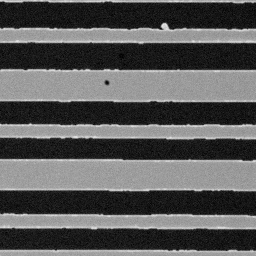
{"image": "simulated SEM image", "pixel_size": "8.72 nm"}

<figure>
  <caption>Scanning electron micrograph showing lines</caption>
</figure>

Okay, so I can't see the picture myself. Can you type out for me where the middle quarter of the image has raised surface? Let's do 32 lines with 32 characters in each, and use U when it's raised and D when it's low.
DDDDDDDDDDDDDDDDDDDDDDDDDDDDDDDD
DDUUUUUDDDUUUUDDDDDDDDDDDDDDUDDD
UUUUUUUUUUUUUUUUUUUUUUUUUUUUUUUU
UUUUUUUUUUUUUUUUUUUUUUUUUUUUUUUU
UUUUUUUUUUUUUUUUUUUUUUUUUUUUUUUU
UUUUUUUUUUUUUUUUUUUUUUUUUUUUUUUU
UUUUUUUUUUUUUUUUUUUUUUUUUUUUUUUU
UUUUUUUUUUUUUUUUUUUUUUUUUUUUUUUU
UUUUUUUUUUUUUUUUUUUUUUUUUUUUUUUU
DDDDDDDDDDDDDDDDDDDDDDDDDDDDDDDD
DDDDDDDDDDDDDDDDDDDDDDDDDDDDDDDD
DDDDDDDDDDDDDDDDDDDDDDDDDDDDDDDD
DDDDDDDDDDDDDDDDDDDDDDDDDDDDDDDD
DDDDDDDDDDDDDDDDDDDDDDDDDDDDDDDD
DDDDDDDDDDDDDDDDDDDDDDDDDDDDDDDD
UUUUUUUUUUUUUUUUUUUUUUUUUUUUUUUU
UUUUUUUUUUUUUUUUUUUUUUUUUUUUUUUU
UUUUUUUUUUUUUUUUUUUUUUUUUUUUUUUU
DDDDDDDDDDDDDDDDDDDDDDDDDDUUUUUU
DDDDDDDDDDDDDDDDDDDDDDDDDDDDDDDD
DDDDDDDDDDDDDDDDDDDDDDDDDDDDDDDD
DDDDDDDDDDDDDDDDDDDDDDDDDDDDDDDD
DDDDDDDDDDDDDDDDDDDDDDDDDDDDDDDD
DDDDDDDDDDDDDDDDDDDDDDDDDDDDDDDD
UUUUUUUUUUUUUUUUUUUUUUUUUUUUUUUU
UUUUUUUUUUUUUUUUUUUUUUUUUUUUUUUU
UUUUUUUUUUUUUUUUUUUUUUUUUUUUUUUU
UUUUUUUUUUUUUUUUUUUUUUUUUUUUUUUU
UUUUUUUUUUUUUUUUUUUUUUUUUUUUUUUU
UUUUUUUUUUUUUUUUUUUUUUUUUUUUUUUU
UUUUUUUUUUUUUUUUUUUUUUUUUUUUUUUU
DDDDDDDDDDDDUUUDUUUUUDDDDDDDDDDD